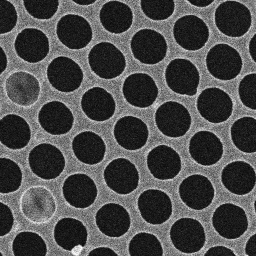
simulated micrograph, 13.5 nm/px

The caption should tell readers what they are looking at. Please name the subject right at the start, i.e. a regular array of holes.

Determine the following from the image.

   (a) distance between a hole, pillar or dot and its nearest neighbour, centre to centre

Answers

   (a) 591 nm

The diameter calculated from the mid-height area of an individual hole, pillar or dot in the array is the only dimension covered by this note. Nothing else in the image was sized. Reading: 35.5 pixels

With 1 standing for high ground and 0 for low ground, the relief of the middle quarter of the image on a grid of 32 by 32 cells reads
00001100000000011111111111000000
00000110000000011111111110000000
00000111000000111000011110000000
00000111100001110000001110000000
00000111111111100000000111000000
00001111111111100000000111000000
00011100001111100000000011100000
11111000000011100000000111111000
11110000000011100000000111111111
11110000000001110000000111001111
01110000000001111000011100000011
00111000000001111111111000000001
00111000000011111111111000000001
00111100000111000011111000000000
00111111111110000000111000000000
00111111111110000000011000000000
00111111111100000000011100000001
11110000111100000000011110000011
11000000011110000000011111111111
11000000001110000000011111111110
11000000001111000000111000111110
11000000001111110011110000001110
11100000001111111111100000000111
11100000001110011111100000000111
11110000011100000111100000000111
11111111111000000011100000000111
11111111110000000011100000000111
11100111110000000001110000001111
10000001110000000001111000011100
00000000110000000001111111111000
00000000111000000011111111111000
00000000111100000011100011111000